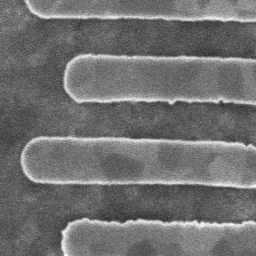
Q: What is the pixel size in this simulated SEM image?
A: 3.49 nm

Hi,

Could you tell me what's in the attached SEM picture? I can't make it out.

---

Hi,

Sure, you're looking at one or a few lines or trenches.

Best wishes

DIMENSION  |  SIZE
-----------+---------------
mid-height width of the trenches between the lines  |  137 nm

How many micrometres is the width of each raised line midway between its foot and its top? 0.15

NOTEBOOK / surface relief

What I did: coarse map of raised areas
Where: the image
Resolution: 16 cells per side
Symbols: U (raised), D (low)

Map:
DDUUUUUUUUUUUUUU
DDDDDDDDDDDDDDDD
DDDDDDDDDDDDDDDD
DDDDDUUDDDDDDDDD
DDDDUUUUUUUUUUUU
DDDDUUUUUUUUUUUU
DDDDDDDDDDDDDDDD
DDDDDDDDDDDDDDDD
DDDDDDDDDDDDDDDD
DUUUUUUUUUUUUUUU
DUUUUUUUUUUUUUUU
DDDDDDDDUDDDUUUU
DDDDDDDDDDDDDDDD
DDDDDDDDDDDDDDDD
DDDDUUUUUUUUUUUU
DDDDUUUUUUUUUUUU